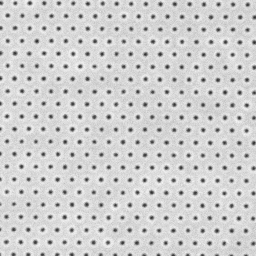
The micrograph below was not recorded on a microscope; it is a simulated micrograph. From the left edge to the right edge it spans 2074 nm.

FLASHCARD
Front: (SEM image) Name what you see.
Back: a regular array of holes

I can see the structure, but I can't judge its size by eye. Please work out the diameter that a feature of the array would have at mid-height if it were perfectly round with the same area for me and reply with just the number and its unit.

43.4 nm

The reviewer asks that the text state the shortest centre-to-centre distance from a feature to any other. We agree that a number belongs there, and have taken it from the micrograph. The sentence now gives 0.115 µm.